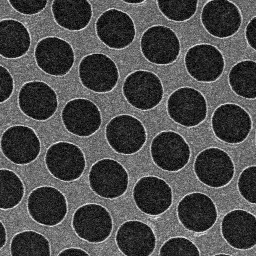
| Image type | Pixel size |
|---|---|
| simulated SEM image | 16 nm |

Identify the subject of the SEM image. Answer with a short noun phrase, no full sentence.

a regular array of holes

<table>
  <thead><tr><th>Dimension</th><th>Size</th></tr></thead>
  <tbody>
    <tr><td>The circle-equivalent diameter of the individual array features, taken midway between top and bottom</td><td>632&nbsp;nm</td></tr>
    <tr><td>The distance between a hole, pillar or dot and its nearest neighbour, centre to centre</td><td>47.2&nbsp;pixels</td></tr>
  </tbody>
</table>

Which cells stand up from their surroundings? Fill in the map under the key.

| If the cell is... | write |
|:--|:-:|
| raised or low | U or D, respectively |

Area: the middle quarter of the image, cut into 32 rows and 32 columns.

DDUUDDDDDDDDDUUUUUUUUUUUUUUUUUDD
DUUUDDDDDDDDDUUUUUUUUUUUUUUUUUUD
DUUUDDDDDDDDDDUUUDDDDDDUUUUUUUUD
UUUUDDDDDDDDDDUDDDDDDDDDUUUUUUUU
UUUUDDDDDDDDDUUDDDDDDDDDUUUUUUUU
UUUUUDDDDDDDDUUDDDDDDDDDDUUUUUUU
UUUUUUUDDDDDUUUDDDDDDDDDDUUUDDDD
UUUUUUUUUUUUUUUDDDDDDDDDDUUDDDDD
UUUUUUUUUUUUUUUDDDDDDDDDDUDDDDDD
UDDDDDDUUUUUUUUUDDDDDDDDUUDDDDDD
DDDDDDDDUUUUUUUUUDDDDDDUUUDDDDDD
DDDDDDDDDUUUUUUUUUUUDUUUUUDDDDDD
DDDDDDDDDUUUUUUUUUUUUUUUUUDDDDDD
DDDDDDDDDUUUDDDDDDUUUUUUUUUDDDDD
DDDDDDDDDUUDDDDDDDDUUUUUUUUUDDDD
DDDDDDDDDUUDDDDDDDDDUUUUUUUUUUDD
UDDDDDDDUUDDDDDDDDDDUUUUUUUUUUUU
UUDDDDDUUUDDDDDDDDDDUUUUDDDDDUUU
UUUUUUUUUUUDDDDDDDDDDUUDDDDDDDUU
UUUUUUUUUUUDDDDDDDDDUUDDDDDDDDUU
DDDUUUUUUUUUDDDDDDDDUUDDDDDDDDDU
DDDDUUUUUUUUUDDDDDDUUUDDDDDDDDDU
DDDDDUUUUUUUUUUDDUUUUUDDDDDDDDDD
DDDDDUUUUUUUUUUUUUUUUUDDDDDDDDDU
DDDDDUUUDDDDDUUUUUUUUUUDDDDDDDDU
DDDDDUUDDDDDDDDUUUUUUUUDDDDDDDUU
DDDDDUUDDDDDDDDUUUUUUUUUUDDDDUUU
DDDDUUDDDDDDDDDDUUUUUUUUUUUUUUUU
DDDDUUDDDDDDDDDDUUUDDDDUUUUUUUUU
UUUUUUDDDDDDDDDDUUDDDDDDDUUUUUUU
UUUUUUUDDDDDDDDDUUDDDDDDDDUUUUUU
UUUUUUUDDDDDDDDDUDDDDDDDDDDUUUUU